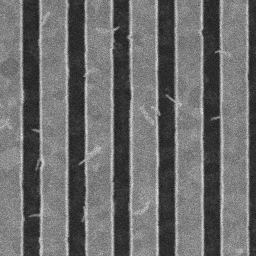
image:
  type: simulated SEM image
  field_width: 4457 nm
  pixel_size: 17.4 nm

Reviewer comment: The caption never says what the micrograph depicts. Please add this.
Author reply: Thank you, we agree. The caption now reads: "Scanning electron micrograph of parallel lines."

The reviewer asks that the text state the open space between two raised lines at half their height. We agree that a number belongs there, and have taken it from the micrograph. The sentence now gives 0.344 µm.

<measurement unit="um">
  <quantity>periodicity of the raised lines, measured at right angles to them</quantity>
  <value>0.786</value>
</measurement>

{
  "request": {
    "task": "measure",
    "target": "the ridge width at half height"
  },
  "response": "25.5 px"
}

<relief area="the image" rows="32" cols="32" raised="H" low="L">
HHHLLHHHLLLHHHLLHHHHLLHHHLLLHHHL
HHHLLHHHLLLHHHLLHHHHLLHHHLLLHHHL
HHHLLHHHLLLHHHLLLHHHLLHHHLLLHHHL
HHHLLHHHLLLHHHLLHHHLLLHHHLLLHHHL
HHHLLHHHLLLHHHLLHHHLLLHHHLLLHHHL
HHHLLHHHLLLHHHLLHHHLLLHHHLLLHHHL
HHHLLHHHLLLHHHLLHHHHLLHHHLLLHHHL
HHHLLHHHLLLHHHLLHHHHLLHHHLLLHHHL
HHHLLHHHLLLHHHLLHHHHLLHHHLLLHHHL
HHHLLHHHLLLHHHLLLHHLLLHHHLLLHHHL
HHHLLHHHLLLHHHLLHHHHLLHHHLLLHHHL
HHHLLHHHLLLHHHLLLHHHLLHHHLLLHHHL
HHHLLHHHLLLHHHLLLHHHLLHHHLLLHHHL
HHHLLHHHLLLHHHLLLHHHLLHHHLLLHHHL
HHHLLHHHLLLHHHLLHHHHLLHHHLLLHHHL
HHHLLHHHLLLHHHLLHHHHLLHHHLLLHHHL
HHHLLHHHLLLHHHLLHHHHLLHHHLLLHHHL
HHHLLHHHLLLHHHLLHHHHLLHHHLLLHHHL
HHHLLHHHLLLHHHLLHHHHLLHHHLLLHHHL
HHHLLHHHLLLHHHLLHHHHLLHHHLLLHHHL
HHHLLHHHLLLHHHLLHHHHLLHHHLLLHHHL
HHHLLHHHLLLHHHLLHHHHLLHHHLLLHHHL
HHHLLHHHLLLHHHLLLHHHLLHHHLLLHHHL
HHHLLHHHLLLHHHLLHHHHLLHHHLLLHHHL
HHHLLHHHLLLHHHLLHHHHLLHHHLLLHHHL
HHHLLHHHLLLHHHLLHHHHLLHHHLLLHHHL
HHHLLHHHLLLHHHLLHHHHLLHHHLLLHHHL
HHHLLHHHLLLHHHLLHHHHLLHHHLLLHHHL
HHHLLHHHLLLHHHLLHHHHLLHHHLLLHHHL
HHHLLHHHLLLHHHLLHHHHLLHHHLLLHHHL
HHHLLHHHLLLHHHLLHHHHLLHHHLLLHHHL
HHHLLHHHLLLHHHLLHHHHLLHHHLLLHHHL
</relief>